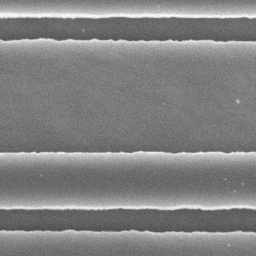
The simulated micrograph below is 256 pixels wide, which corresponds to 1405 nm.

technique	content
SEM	lines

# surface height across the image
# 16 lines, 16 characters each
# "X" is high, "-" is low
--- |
XXXXXXXXXXXXXXXX
----------------
----------------
----------------
----------------
----------------
----------------
----------------
----------------
----------------
XXXXXXXXXXXXXXXX
XXXXXXXXXXXXXXXX
XXXXXXXXXXXXXXXX
----------------
----------------
----------------